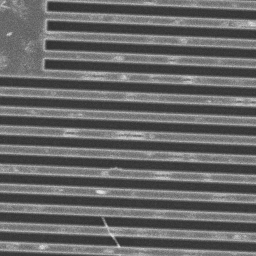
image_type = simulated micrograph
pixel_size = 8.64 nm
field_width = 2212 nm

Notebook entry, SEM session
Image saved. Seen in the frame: parallel lines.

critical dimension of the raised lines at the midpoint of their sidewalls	0.082	microns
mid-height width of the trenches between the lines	82	nanometres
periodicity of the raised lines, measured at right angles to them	0.167	microns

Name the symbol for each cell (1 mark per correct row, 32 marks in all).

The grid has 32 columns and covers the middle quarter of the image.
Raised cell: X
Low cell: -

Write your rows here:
--------------------------------
--------------------------------
XXXXXXXXXXXXXXXXXXXXXX----------
XXXXXXXXXXXXXXXXXXXXXXXXXXXXXXXX
-------------------XXXXXXXXXXXXX
--------------------------------
--------------------------------
XXXXXXXXXXXXXXXXXXXXXXXX--------
XXXXXXXXXXXXXXXXXXXXXXXXXXXXXXXX
--------------------XXXXXXXXXXXX
--------------------------------
XXXXXXX-------------------------
XXXXXXXXXXXXXXXXXXXXXXXXXXXXXX--
XXXXXXXXXXXXXXXXXXXXXXXXXXXXXXXX
----------------------XXXXXXXXXX
--------------------------------
XXXXXXXXX-----------------------
XXXXXXXXXXXXXXXXXXXXXXXXXXXXXXXX
-----XXXXXXXXXXXXXXXXXXXXXXXXXXX
-----------------------------XXX
--------------------------------
XXXXXXXXXXXXXXX-----------------
XXXXXXXXXXXXXXXXXXXXXXXXXXXXXXXX
-------XXXXXXXXXXXXXXXXXXXXXXXXX
-------------------------------X
--------------------------------
XXXXXXXXXXXXXXXXX---------------
XXXXXXXXXXXXXXXXXXXXXXXXXXXXXXXX
--------------XXXXXXXXXXXXXXXXXX
--------------------------------
--------------------------------
XXXXXXXXXXXXXXXXXXXX--XX--------